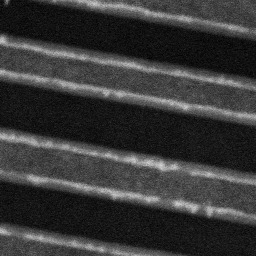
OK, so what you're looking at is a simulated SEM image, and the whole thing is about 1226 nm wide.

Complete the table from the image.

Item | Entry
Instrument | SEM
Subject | one or a few lines or trenches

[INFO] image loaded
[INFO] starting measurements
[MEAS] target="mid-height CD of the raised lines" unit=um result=0.186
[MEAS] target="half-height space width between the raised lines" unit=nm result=248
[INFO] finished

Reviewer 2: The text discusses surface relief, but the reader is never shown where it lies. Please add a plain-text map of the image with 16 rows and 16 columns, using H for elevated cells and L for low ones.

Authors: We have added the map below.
LLLLLLHHHHHHHHHH
LLLLLLLLLLLLHHHH
HLLLLLLLLLLLLLLL
HHHHHHLLLLLLLLLL
HHHHHHHHHHHHLLLL
LLLLHHHHHHHHHHHH
LLLLLLLLLLHHHHHH
LLLLLLLLLLLLLLLL
HLLLLLLLLLLLLLLL
HHHHHHHLLLLLLLLL
HHHHHHHHHHHHLLLL
LLLHHHHHHHHHHHHH
LLLLLLLLLHHHHHHH
LLLLLLLLLLLLLLLH
HLLLLLLLLLLLLLLL
HHHHHHHLLLLLLLLL